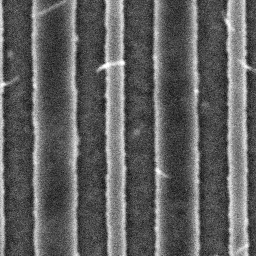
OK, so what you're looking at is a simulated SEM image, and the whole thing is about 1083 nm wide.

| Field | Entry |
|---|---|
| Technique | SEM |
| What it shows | lines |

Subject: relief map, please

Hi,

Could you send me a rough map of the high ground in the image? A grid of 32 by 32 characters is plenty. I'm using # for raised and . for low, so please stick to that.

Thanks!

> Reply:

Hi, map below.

....#####....##....######....##.
....#####....##....######...###.
....#####....##....######...###.
....#####....##....######....##.
....#####....##....######....##.
....#####....##....######...###.
....#####....##....######....##.
....#####....##....######....##.
....#####....##....######....##.
....#####....##....######....##.
....#####....##....######....##.
....#####....##....######....##.
....######...##....######....##.
....#####....##....######....##.
....#####....##....######....##.
....#####....##....######....##.
....######...##....######....##.
....######...##....######....##.
....#####....##....######....##.
....######...###...######....##.
....#####....###....#####....##.
....######...###....#####....##.
....######...###....#####....##.
....######...###....#####....##.
....######...###....#####....##.
....######...###....#####....##.
....#####....###....#####....##.
....######...###....#####....##.
....######...###...######....##.
....######....##....#####....##.
....######....##...######....##.
....######....##....#####....##.